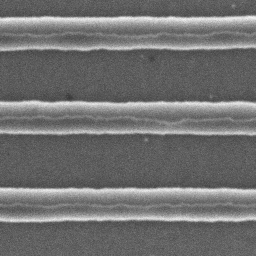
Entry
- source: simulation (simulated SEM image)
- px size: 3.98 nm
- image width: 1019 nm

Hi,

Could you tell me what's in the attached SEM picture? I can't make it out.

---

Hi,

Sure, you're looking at lines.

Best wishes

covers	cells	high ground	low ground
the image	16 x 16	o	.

................
oooooooooooooooo
oooooooooooooooo
................
................
................
oooooooooooooooo
oooooooooooooooo
................
................
................
................
oooooooooooooooo
oooooooooooooooo
................
................